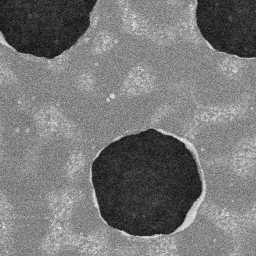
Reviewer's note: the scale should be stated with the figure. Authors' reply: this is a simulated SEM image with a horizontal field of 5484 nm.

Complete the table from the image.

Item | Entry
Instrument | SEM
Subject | holes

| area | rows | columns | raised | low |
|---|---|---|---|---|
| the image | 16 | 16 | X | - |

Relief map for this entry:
------XXXXXX----
------XXXXXX----
-----XXXXXXXX---
XX--XXXXXXXXXXX-
XXXXXXXXXXXXXXXX
XXXXXXXXXXXXXXXX
XXXXXXXXXXXXXXXX
XXXXXXXXXXXXXXXX
XXXXXXXX---XXXXX
XXXXXX------XXXX
XXXXXX-------XXX
XXXXXX-------XXX
XXXXXX------XXXX
XXXXXX------XXXX
XXXXXXXX---XXXXX
XXXXXXXXXXXXXXXX